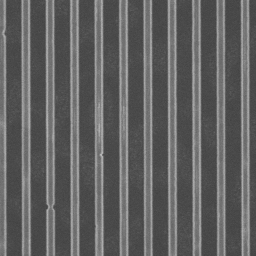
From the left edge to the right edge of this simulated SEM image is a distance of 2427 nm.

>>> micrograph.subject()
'parallel lines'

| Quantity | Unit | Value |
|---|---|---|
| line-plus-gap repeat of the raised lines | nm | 231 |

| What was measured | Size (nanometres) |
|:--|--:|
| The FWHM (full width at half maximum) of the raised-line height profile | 64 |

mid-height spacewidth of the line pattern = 168 nm